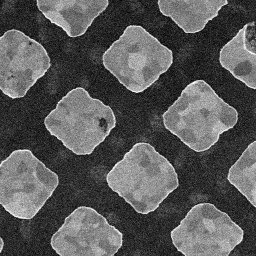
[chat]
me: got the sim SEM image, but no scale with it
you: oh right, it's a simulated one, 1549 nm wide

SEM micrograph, raised bodies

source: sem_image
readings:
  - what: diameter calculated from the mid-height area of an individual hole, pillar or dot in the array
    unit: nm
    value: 377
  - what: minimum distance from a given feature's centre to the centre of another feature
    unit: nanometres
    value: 509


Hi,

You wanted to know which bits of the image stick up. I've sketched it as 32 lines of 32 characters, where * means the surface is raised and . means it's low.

.....********.......********....
.....********.......*******.....
......******..........****......
........***.....**.....**.......
***......*.....****..........**.
*****.........******........***.
******.......********.......***.
******.......********.......****
******.......********.......****
*.***.........******.........***
****...........****.....**.....*
***......**............****.....
........****..........******....
.......*******.......********...
......********......**********..
......******.........********...
......*******.........******....
........*****..........****.....
.........***.....**.....**.....*
.***............****..........**
*****..........******.*......***
*******.......********.......***
*******......*********.......***
*******.......********........**
******.........******..........*
*****............***.....*......
.****....***.....**.....****....
........*****..........******...
........******........********..
.......********......*********..
......*********.......********..
.......********........******...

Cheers